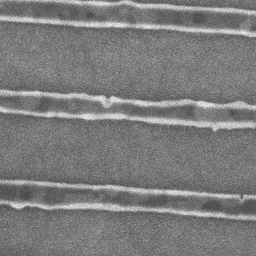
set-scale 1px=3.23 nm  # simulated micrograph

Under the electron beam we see one or a few lines or trenches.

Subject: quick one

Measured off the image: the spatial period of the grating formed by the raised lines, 296 nm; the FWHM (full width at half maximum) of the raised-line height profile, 69 nanometers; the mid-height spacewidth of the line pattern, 71 pixels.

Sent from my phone